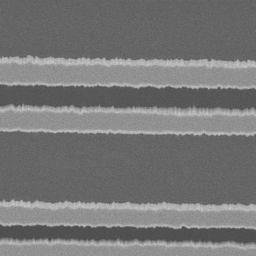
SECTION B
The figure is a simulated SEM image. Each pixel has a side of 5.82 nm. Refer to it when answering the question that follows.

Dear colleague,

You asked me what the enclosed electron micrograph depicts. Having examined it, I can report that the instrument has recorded lines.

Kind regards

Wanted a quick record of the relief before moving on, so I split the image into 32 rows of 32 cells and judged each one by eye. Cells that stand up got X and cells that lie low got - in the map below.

--------------------------------
--------------------------------
--------------------------------
--------------------------------
--------------------------------
--------------------------------
--------------------------------
XXXXXXXX--X-X-X-----------------
XXXXXXXXXXXXXXXXXXXXXXXXXXXXXXXX
XXXXXXXXXXXXXXXXXXXXXXXXXXXXXXXX
XXXXXXXXXXXXXXXXXXXXXXXXXXXXXXXX
--------------------------------
--------------------------------
XXXXXXXXXXXXX----X--------------
XXXXXXXXXXXXXXXXXXXXXXXXXXXXXXXX
XXXXXXXXXXXXXXXXXXXXXXXXXXXXXXXX
---XX-XXXXXXXXXXXXXXXXXXXXXXXXXX
--------------------------------
--------------------------------
--------------------------------
--------------------------------
--------------------------------
--------------------------------
--------------------------------
--------------------------------
XXXXXXXXXXXXX-XXX---X-----------
XXXXXXXXXXXXXXXXXXXXXXXXXXXXXXXX
XXXXXXXXXXXXXXXXXXXXXXXXXXXXXXXX
-------------------------------X
--------------------------------
XXXXXXXXXXXXXXXXXXXXXXXXXXXXXXXX
XXXXXXXXXXXXXXXXXXXXXXXXXXXXXXXX